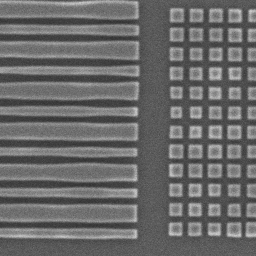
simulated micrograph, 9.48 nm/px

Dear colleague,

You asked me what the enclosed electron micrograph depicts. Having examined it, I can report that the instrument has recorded groups of lines, slits or small figures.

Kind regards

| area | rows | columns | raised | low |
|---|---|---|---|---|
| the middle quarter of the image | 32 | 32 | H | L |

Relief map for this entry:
LLLLLLLLLLLLLLLLLLLLLLLLLLLLLLLL
HHHHHHHHHHHHHHHHHHHLLLLLLLLHHLLL
HLLLLLLLLLHHHHHHHHHLLLLLLLLHHLLL
LLLLLLLLLLLLLLLLLLLLLLLLLLLHHLLL
LLLLLLLLLLLLLLLLLLLLLLLLLLLLLLLL
HHHHHHHHHHHHHHHHHHLLLLLLLLLLLLLL
HHHHHHHHHHHHHHHHHHLLLLLLLLLHHLLL
HHHHHHHHHHHHHHHHHHLLLLLLLLLHHLLL
HHHHHHHHHHHHHHHHHHLLLLLLLLLHHLLL
LLLLLLLLLLLLLLLLLLLLLLLLLLLLLLLL
LLLLLLLLLLLLLLLLLLLLLLLLLLLLLLLL
HHHHHHHHHHHHHHHHHHLLLLLLLLLHHLLL
HHHHHHHHHHHHHHHHHHLLLLLLLLLHHLLL
LLLLLLLLLLLLLLLLLLLLLLLLLLLLLLLL
LLLLLLLLLLLLLLLLLLLLLLLLLLLLLLLL
HHHHHHHHHHHHHHHHHHLLLLLLLLLLLLLL
HHHHHHHHHHHHHHHHHHLLLLLLLLLHHLLL
HHHHHHHHHHHHHHHHHHLLLLLLLLLHHLLL
HHHHHHHHHHHHHHHHHHLLLLLLLLLLLLLL
LLLLLLLLLLLLLLLLLLLLLLLLLLLLLLLL
LLLLLLLLLLLLLLLLLLLLLLLLLLHHHLLH
HHHHHHHHHHHHHHHHHHLLLLLLLLHHHHLH
HHHHHHHHHHHHHHHHHHLLLLLLLLHHHHLH
LLLLLLLLLLLLLLLLLLLLLLLLLLLLLLLL
LLLLLLLLLLLLLLLLLLLLLLLLLLLLLLLL
HHHHHHHHHHHHHHHHHHLLLLLLLLHHHLLH
HHHHHHHHHHHHHHHHHHLLLLLLLLLHHLLH
HHHHHHHHHHHHHHHHHHLLLLLLLLLHHLLH
HHHHHHHHHHHHHHHHHHLLLLLLLLLLLLLL
LLLLLLLLLLLLLLLLLLLLLLLLLLLLLLLL
LLLLLLLLLLLLLLLLLLLLLLLLLLHHHLLL
HHHHHHHHHHHHHLHHHHLLLLLLLLHHHLLL